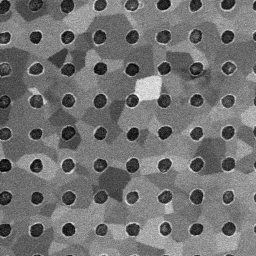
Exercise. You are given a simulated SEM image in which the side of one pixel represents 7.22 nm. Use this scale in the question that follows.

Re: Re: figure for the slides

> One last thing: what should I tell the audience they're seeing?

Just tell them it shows a regular array of holes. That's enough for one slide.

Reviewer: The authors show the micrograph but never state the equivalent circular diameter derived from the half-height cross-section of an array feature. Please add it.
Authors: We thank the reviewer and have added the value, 99.8 nm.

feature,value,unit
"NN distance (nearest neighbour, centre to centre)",227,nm